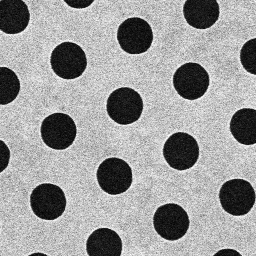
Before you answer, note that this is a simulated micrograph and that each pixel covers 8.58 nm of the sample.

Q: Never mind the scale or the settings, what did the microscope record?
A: a regular array of holes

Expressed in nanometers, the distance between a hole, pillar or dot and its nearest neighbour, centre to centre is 608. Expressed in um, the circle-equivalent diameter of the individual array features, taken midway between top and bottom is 0.317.